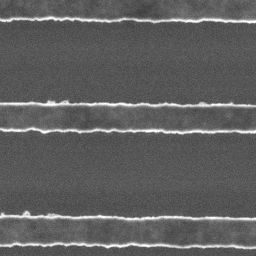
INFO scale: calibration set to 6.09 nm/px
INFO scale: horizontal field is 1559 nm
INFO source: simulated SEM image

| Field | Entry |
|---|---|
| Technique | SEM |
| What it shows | lines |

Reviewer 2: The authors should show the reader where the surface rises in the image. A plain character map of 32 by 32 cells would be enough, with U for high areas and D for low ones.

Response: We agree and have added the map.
UUUUUUUUUUUUUUUUUUUUUUUUUUUUUUUU
UUUUUUUUUUUUUUUUUUUUUUUUUUUUUUUU
UUDUUUDUDUUUUUUUUUUUUUUUUUUUUUUU
DDDDDDDDDDDDDDDDDDDDDDDDDDDDDDDD
DDDDDDDDDDDDDDDDDDDDDDDDDDDDDDDD
DDDDDDDDDDDDDDDDDDDDDDDDDDDDDDDD
DDDDDDDDDDDDDDDDDDDDDDDDDDDDDDDD
DDDDDDDDDDDDDDDDDDDDDDDDDDDDDDDD
DDDDDDDDDDDDDDDDDDDDDDDDDDDDDDDD
DDDDDDDDDDDDDDDDDDDDDDDDDDDDDDDD
DDDDDDDDDDDDDDDDDDDDDDDDDDDDDDDD
DDDDDDDDDDDDDDDDDDDDDDDDDDDDDDDD
DDDDDDDDDDDDDDDDDDDDDDDDDDDDDDDD
UUUUUUUUUUUUUUUUUUUUUUUUUUUUUUUU
UUUUUUUUUUUUUUUUUUUUUUUUUUUUUUUU
UUUUUUUUUUUUUUUUUUUUUUUUUUUUUUUU
DDDDDUDDDDDDDDDDDDDDUUUUDUUDDDUU
DDDDDDDDDDDDDDDDDDDDDDDDDDDDDDDD
DDDDDDDDDDDDDDDDDDDDDDDDDDDDDDDD
DDDDDDDDDDDDDDDDDDDDDDDDDDDDDDDD
DDDDDDDDDDDDDDDDDDDDDDDDDDDDDDDD
DDDDDDDDDDDDDDDDDDDDDDDDDDDDDDDD
DDDDDDDDDDDDDDDDDDDDDDDDDDDDDDDD
DDDDDDDDDDDDDDDDDDDDDDDDDDDDDDDD
DDDDDDDDDDDDDDDDDDDDDDDDDDDDDDDD
DDDDDDDDDDDDDDDDDDDDDDDDDDDDDDDD
DDDDDDDDDDDDDDDDDDDDDDDDDDDDDDDD
UUUUUUUUUUUUUUUUUUUUUUUUUUUUUUUU
UUUUUUUUUUUUUUUUUUUUUUUUUUUUUUUU
UUUUUUUUUUUUUUUUUUUUUUUUUUUUUUUU
UUUUUUUUUUUUUUUUUUUUUUUUUUUUUUUU
DDDDDDDDDDDDDDDDDDDDDDDDDDDDDDDD